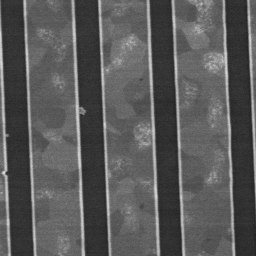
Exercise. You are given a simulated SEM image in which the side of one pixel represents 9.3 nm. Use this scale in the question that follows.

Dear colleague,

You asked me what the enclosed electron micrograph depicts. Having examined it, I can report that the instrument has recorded one or a few lines or trenches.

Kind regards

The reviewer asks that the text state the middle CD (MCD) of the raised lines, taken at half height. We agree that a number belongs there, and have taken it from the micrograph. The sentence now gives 0.459 um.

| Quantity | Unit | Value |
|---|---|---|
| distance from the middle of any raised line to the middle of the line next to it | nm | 695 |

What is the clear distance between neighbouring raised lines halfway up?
0.229 µm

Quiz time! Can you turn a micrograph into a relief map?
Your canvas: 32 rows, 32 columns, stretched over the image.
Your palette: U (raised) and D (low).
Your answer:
DDDUUUUUUDDDUUUUUUUDDDUUUUUUDDDU
DDDUUUUUUDDDUUUUUUUDDDUUUUUUDDDU
DDDUUUUUUDDDUUUUUUUDDDUUUUUUDDDU
DDDUUUUUUDDDDUUUUUUDDDUUUUUUDDDU
DDDUUUUUUDDDDUUUUUUDDDUUUUUUDDDU
DDDUUUUUUDDDDUUUUUUDDDUUUUUUDDDU
DDDUUUUUUDDDDUUUUUUDDDUUUUUUDDDU
DDDUUUUUUDDDDUUUUUUDDDUUUUUUDDDU
DDDUUUUUUDDDDUUUUUUDDDUUUUUUDDDU
DDDUUUUUUDDDDUUUUUUDDDUUUUUUDDDU
DDDUUUUUUUDDDUUUUUUDDDUUUUUUDDDU
DDDUUUUUUUDDDUUUUUUDDDUUUUUUDDDU
DDDDUUUUUUDDDUUUUUUDDDUUUUUUDDDD
DDDDUUUUUUDDDUUUUUUDDDUUUUUUDDDD
DDDDUUUUUUDDDUUUUUUDDDUUUUUUUDDD
DDDDUUUUUUDDDUUUUUUDDDUUUUUUUDDD
UDDDUUUUUUDDDUUUUUUDDDUUUUUUUDDD
UDDDUUUUUUDDDUUUUUUDDDUUUUUUUDDD
UDDDUUUUUUDDDUUUUUUDDDUUUUUUUDDD
UDDDUUUUUUDDDUUUUUUDDDUUUUUUUDDD
UDDDUUUUUUDDDUUUUUUDDDUUUUUUUDDD
UDDDUUUUUUDDDUUUUUUDDDDUUUUUUDDD
UDDDUUUUUUDDDUUUUUUDDDDUUUUUUDDD
UDDDUUUUUUDDDUUUUUUDDDDUUUUUUDDD
UDDDUUUUUUDDDUUUUUUDDDDUUUUUUDDD
UDDDUUUUUUDDDUUUUUUUDDDUUUUUUDDD
UDDDUUUUUUDDDUUUUUUUDDDUUUUUUDDD
UDDDUUUUUUDDDDUUUUUUDDDUUUUUUDDD
UDDDUUUUUUDDDDUUUUUUDDDUUUUUUDDD
UDDDUUUUUUDDDDUUUUUUDDDUUUUUUDDD
UDDDUUUUUUDDDDUUUUUUDDDUUUUUUDDD
UDDDUUUUUUDDDDUUUUUUDDDUUUUUUDDD